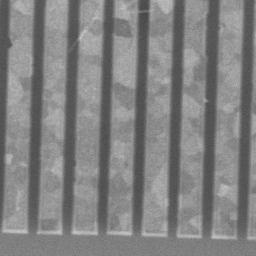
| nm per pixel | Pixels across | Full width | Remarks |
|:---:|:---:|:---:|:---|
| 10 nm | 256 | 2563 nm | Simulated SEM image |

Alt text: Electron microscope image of parallel lines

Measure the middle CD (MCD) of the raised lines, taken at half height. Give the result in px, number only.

22.4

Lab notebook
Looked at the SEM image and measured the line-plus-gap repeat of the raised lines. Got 0.349 micrometres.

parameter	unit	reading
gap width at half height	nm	121